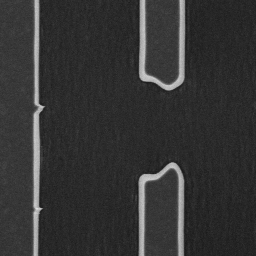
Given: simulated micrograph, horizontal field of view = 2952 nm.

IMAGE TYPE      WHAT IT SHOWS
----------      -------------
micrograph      one or a few lines or trenches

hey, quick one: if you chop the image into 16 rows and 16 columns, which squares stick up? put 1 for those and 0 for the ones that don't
1100000001100000
1100000001100000
1100000001100000
1100000001100000
1100000001100000
1100000000000000
1100000000000000
1100000000000000
1100000000000000
1100000000000000
1100000000100000
1100000001100000
1100000001100000
1100000001100000
1100000001100000
1100000001100000